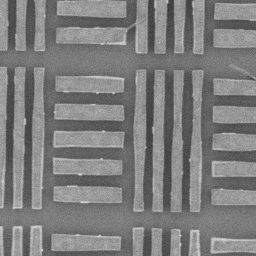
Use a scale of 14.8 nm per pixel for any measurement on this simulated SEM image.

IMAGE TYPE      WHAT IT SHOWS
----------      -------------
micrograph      groups of lines, slits or small figures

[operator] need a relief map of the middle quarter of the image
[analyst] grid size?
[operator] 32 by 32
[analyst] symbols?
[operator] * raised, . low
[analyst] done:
................................
................................
..................**...**...**..
***********.......**...**...**..
***************...**...**...**..
***************...**...**..***..
***************...**...**..***..
..................**...**..**...
..................**...**..**...
..................**...**...*...
***********.......**...**...*...
***************...**...**...*...
***************...**..***...*...
***************...**..***...*...
..................**..***...*...
.................***..***..**...
.................***..***..**...
***************..***..***..**...
***************..***..***..**...
***************...**..***..**...
..................**..***..**...
..................**..***..**...
..................**..***..**...
..................**..***..**...
**************....**..***..**...
**************....**..***..**...
**************....**..***..**...
........*****.....**..***..**...
..................**..***..**...
..................**..**...**...
..................*...**...**...
**************....*...**...**...